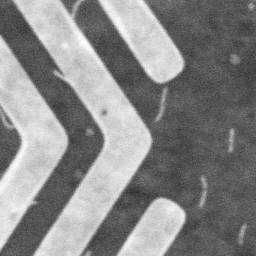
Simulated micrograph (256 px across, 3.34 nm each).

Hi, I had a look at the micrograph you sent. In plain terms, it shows groups of lines, slits or small figures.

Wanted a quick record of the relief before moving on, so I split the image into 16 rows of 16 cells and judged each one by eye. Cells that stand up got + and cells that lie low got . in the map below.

.+++...++.......
..+++..+++......
...++...+++.....
+..+++..+++.....
++..+++..++.....
++...++.........
+++..+++........
.+++..+++.......
.+++...++.......
.+++..+++.......
.++...+++.......
+++..+++........
++..+++.........
+...+++..++.....
+..+++..+++.....
..+++...++......